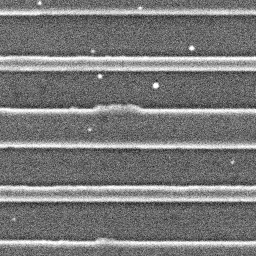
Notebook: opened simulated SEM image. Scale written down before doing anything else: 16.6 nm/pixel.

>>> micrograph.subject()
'lines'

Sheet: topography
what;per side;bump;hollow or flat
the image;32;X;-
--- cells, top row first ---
XXXXXXXXXXXXXXXXXXXXXXXXXXXXXXXX
XXXXXXXXXXXXXXXXXXXXXXXXXXXXXXXX
--------------------------------
--------------------------------
--------------------------------
--------------------------------
--------------------------------
XXXXXXXXXXXXXXXXXXXXXXXXXXXXXXXX
XXXXXXXXXXXXXXXXXXXXXXXXXXXXXXXX
--------------------------------
--------------------------------
--------------------------------
--------------------------------
------------XXXXX---------------
XXXXXXXXXXXXXXXXXXXXXXXXXXXXXXXX
XXXXXXXXXXXXXXXXXXXXXXXXXXXXXXXX
XXXXXXXXXXXXXXXXXXXXXXXXXXXXXXXX
XXXXXXXXXXXXXXXXXXXXXXXXXXXXXXXX
--------------------------------
--------------------------------
--------------------------------
--------------------------------
--------------------------------
XXXXXXXXXXXXXXXXXXXXXXXXXXXXXXXX
XXXXXXXXXXXXXXXXXXXXXXXXXXXXXXXX
--------------------------------
--------------------------------
--------------------------------
--------------------------------
--------------------------------
XXXXXXXXXXXXXXXXXXXXXXXXXXXXXXXX
XXXXXXXXXXXXXXXXXXXXXXXXXXXXXXXX